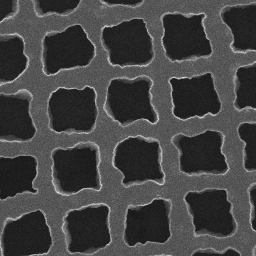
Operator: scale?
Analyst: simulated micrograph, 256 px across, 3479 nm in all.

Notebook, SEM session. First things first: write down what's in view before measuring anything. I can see a regular array of holes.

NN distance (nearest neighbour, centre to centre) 798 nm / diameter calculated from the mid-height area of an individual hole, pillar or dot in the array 638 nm